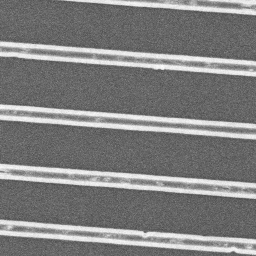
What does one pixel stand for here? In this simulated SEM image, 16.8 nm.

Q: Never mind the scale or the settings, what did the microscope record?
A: parallel lines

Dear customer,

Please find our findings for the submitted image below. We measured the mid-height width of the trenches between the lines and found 0.796 microns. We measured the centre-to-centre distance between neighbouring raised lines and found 997 nm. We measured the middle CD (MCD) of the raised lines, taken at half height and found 189 nm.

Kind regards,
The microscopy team